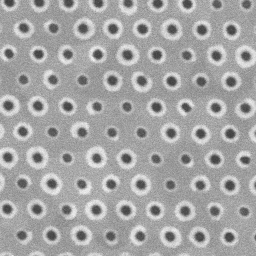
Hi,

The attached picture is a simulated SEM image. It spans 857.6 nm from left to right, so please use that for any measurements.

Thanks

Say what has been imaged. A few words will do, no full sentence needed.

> a regular array of holes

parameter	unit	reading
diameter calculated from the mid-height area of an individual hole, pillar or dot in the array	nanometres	36.3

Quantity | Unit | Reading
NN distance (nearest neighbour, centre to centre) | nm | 97.8